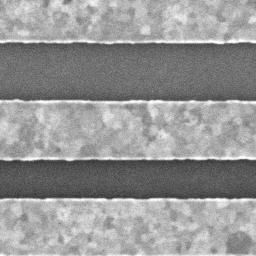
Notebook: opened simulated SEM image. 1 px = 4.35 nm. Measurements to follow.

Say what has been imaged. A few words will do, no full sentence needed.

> lines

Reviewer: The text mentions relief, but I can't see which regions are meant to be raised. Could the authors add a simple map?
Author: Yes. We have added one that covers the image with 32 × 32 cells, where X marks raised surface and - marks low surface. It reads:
XXXXXXXXXXXXXXXXXXXXXXXXXXXXXXXX
XXXXXXXXXXXXXXXXXXXXXXXXXXXXXXXX
XXXXXXXXXXXXXXXXXXXXXXXXXXXXXXXX
XXXXXXXXXXXXXXXXXXXXXXXXXXXXXXXX
XXXXXXXXXXXXXXXXXXXXXXXXXXXXXXXX
--------------------------------
--------------------------------
--------------------------------
--------------------------------
--------------------------------
--------------------------------
--------------------------------
--------------------------------
XXXXXXXXXXXXXXXXXXXXXXXXXXXXXXXX
XXXXXXXXXXXXXXXXXXXXXXXXXXXXXXXX
XXXXXXXXXXXXXXXXXXXXXXXXXXXXXXXX
XXXXXXXXXXXXXXXXXXXXXXXXXXXXXXXX
XXXXXXXXXXXXXXXXXXXXXXXXXXXXXXXX
XXXXXXXXXXXXXXXXXXXXXXXXXXXXXXXX
XXXXXXXXXXXXXXXXXXXXXXXXXXXXXXXX
--------------------------------
--------------------------------
--------------------------------
--------------------------------
--------------------------------
XXXXXXXXXXXXXXXXXXXXXXXXXXXXXXXX
XXXXXXXXXXXXXXXXXXXXXXXXXXXXXXXX
XXXXXXXXXXXXXXXXXXXXXXXXXXXXXXXX
XXXXXXXXXXXXXXXXXXXXXXXXXXXXXXXX
XXXXXXXXXXXXXXXXXXXXXXXXXXXXXXXX
XXXXXXXXXXXXXXXXXXXXXXXXXXXXXXXX
XXXXXXXXXXXXXXXXXXXXXXXXXXXXXXXX